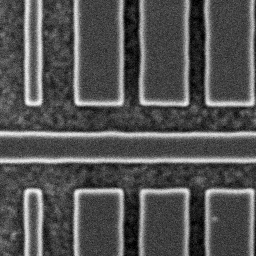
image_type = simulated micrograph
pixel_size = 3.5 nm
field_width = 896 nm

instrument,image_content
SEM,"groups of lines, slits or small figures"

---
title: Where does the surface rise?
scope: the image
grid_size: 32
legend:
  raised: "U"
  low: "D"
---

DDDUUDDDDUUUUUUDDDUUUUUDDDUUUUUU
DDDUUDDDDUUUUUUDDDUUUUUDDDUUUUUU
DDDUUDDDDUUUUUUDDDUUUUUDDDUUUUUU
DDDUUDDDDUUUUUUDDDUUUUUDDDUUUUUU
DDDUUDDDDUUUUUUDDDUUUUUDDDUUUUUU
DDDUUDDDDUUUUUUDDDUUUUUDDDUUUUUU
DDDUUDDDDUUUUUUDDDUUUUUDDDUUUUUU
DDDUUDDDDDUUUUUDDDUUUUUDDDUUUUUU
DDDUUDDDDUUUUUUDDDUUUUUDDDUUUUUU
DDDUUDDDDUUUUUUDDDUUUUUDDDUUUUUU
DDDUUDDDDUUUUUUDDUUUUUUDDDUUUUUU
DDDUUDDDDUUUUUUDDDUUUUUDDDUUUUUU
DDDUUDDDDDUUUUUDDDUUUUUDDDUUUUUU
DDDDDDDDDDDDDDDDDDDDDDDDDDDDDDDD
DDDDDDDDDDDDDDDDDDDDDDDDDDDDDDDD
DDDDDDDDDDDDDDDDDDDDDDDDDDDDDDDD
DDDDDDDDDDDDDDDDDDDDDDDDDDDDDDDD
UUUUUUUUUUUUUUUUUUUUUUUUUUUUUUUU
UUUUUUUUUUUUUUUUUUUUUUUUUUUUUUUU
UUUUUUUUUUUUUUUUUUUUUUUUUUUUUUUU
DDDDDDDDDDDDDDDDDDDDDDDDDDDDDDDD
DDDDDDDDDDDDDDDDDDDDDDDDDDDDDDDD
DDDDDDDDDDDDDDDDDDDDDDDDDDDDDDDD
DDDDDDDDDDDDDDDDDDDDDDDDDDDDDDDD
DDDUUDDDDUUUUUUDDDUUUUUDDDUUUUUU
DDDUUDDDDUUUUUUDDDUUUUUDDDUUUUUU
DDDUUDDDDUUUUUUDDDUUUUUDDDUUUUUU
DDDUUDDDDUUUUUUDDDUUUUUDDDUUUUUU
DDDUUDDDDUUUUUUDDDUUUUUDDDUUUUUU
DDDUUDDDDUUUUUUDDUUUUUUDDDUUUUUU
DDDUUDDDDUUUUUUDDUUUUUUDDDUUUUUU
DDDUUDDDDUUUUUUDDUUUUUUDDDUUUUUU